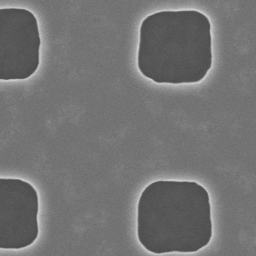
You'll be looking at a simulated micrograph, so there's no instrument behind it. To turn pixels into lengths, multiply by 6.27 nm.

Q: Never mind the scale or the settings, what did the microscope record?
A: holes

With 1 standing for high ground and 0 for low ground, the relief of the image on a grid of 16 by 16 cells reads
1111111111111111
0011111110000111
0011111110000111
0011111110000111
0011111110000111
1111111111111111
1111111111111111
1111111111111111
1111111111111111
1111111111111111
1111111111111111
0011111110001111
0011111110000111
0011111110000111
0011111110000111
1111111110000111